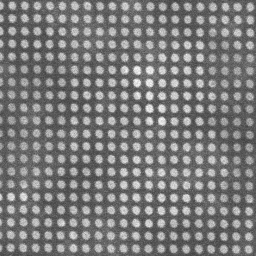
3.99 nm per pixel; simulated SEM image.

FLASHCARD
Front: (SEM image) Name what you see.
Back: a regular array of raised bodies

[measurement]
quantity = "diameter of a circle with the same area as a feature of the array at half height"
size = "29.9 nm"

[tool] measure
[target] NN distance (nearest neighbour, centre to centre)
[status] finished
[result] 48.9 nm